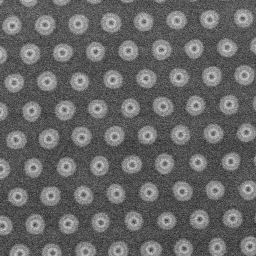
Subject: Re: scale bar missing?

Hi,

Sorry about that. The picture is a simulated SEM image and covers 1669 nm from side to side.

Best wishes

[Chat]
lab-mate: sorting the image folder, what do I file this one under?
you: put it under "an array of small figures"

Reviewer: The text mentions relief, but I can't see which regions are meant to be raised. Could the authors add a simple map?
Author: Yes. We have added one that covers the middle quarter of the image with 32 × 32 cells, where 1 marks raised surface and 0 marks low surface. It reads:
00000000000000000000000000000000
00000000000000000000100000011100
00011000001111000011111000111110
00111100001111000011111000111110
00111100001111000011111000011110
00111100000111000001110000001000
00011000000000000000000000000000
00000000000000000000000000000000
00000000000000000000000111000001
11000001110000011100001111100001
11100011111000111110001111100001
11100011111000011110000111100001
11000011110000011100000111100000
11000000000000000000000000000000
00000000000000000000000000000000
00000000000000000000000000001100
00011100000111100001111000011110
00111110001111100001111000011110
00111110001111100001111000011110
00111100000111100001110000001110
00001000000000000000000000000000
00000000000000000000000000000000
00000000000000000000000001000000
00000000110000011110000111100000
11100001111000011110000111100001
11100001111000011110000111100000
11100001111000011110000111100000
11000001110000000000000000000000
00000000000000000000000000000000
00000000000000000000000000000100
00000000000011000000111000011111
00011110000111100001111000011111